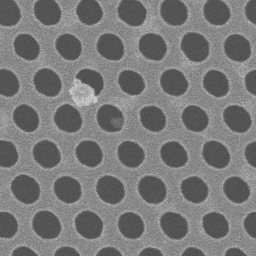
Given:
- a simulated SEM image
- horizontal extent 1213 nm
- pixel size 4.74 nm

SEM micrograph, a regular array of holes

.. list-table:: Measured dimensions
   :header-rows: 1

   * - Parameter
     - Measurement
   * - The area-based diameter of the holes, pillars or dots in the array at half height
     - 128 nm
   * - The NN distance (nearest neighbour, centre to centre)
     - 194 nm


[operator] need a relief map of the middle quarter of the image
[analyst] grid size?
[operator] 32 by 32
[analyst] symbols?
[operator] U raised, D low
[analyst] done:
UUUUUUUUUUUUUUUUUUUUUUUUUUUUUUUU
UUUUDDDUUUUUUUUUUUUUUUUUUUDDUUUU
UUUDDDDDDUUUUUDDDDDUUUUUUDDDDDUU
UUUDDDDDDDUUUUDDDDDDUUUUDDDDDDUU
UUUUDDDDDDUUUUDDDDDDUUUUDDDDDDDU
UUUUUUDDDDUUUUDDDDDDUUUUDDDDDDDU
UUUUUUUDDDUUUUUDDDDDUUUUUDDDDDDU
UUUUUUUDDUUUUUUUDDDUUUUUUUUDDDUU
UUUUUUUUUUUUUUUUUUUUUUUUUUUUUUUU
UUUUUUUUUUUUUUUUUUUUUUUUUUUUUUUU
DDUUUUUUUUDDUUUUUUUUUUUUUUUUUUUD
DDDUUUUUUDDDDDUUUUUDDDDDUUUUUUDD
DDDDUUUUDDDDDDDUUUUDDDDDDUUUUDDD
DDDDUUUUDDDDDDDUUUUDDDDDDUUUUDDD
DDDDDUUUDDDDDDDUUUUDDDDDDDUUUUDD
DDDDUUUUUDDDDDDUUUUUDDDDDUUUUUDD
DDDDUUUUUUDDDDUUUUUUUDDDUUUUUUUU
UUUUUUUUUUUUUUUUUUUUUUUUUUUUUUUU
UUUUUUUUUUUUUUUUUUUUUUUUUUUUUUUU
UUUUDDDDUUUUUUUDDDUUUUUUUUDDUUUU
UUUDDDDDDUUUUUDDDDDUUUUUDDDDDDUU
UUUDDDDDDUUUUDDDDDDDUUUUDDDDDDUU
UUUDDDDDDUUUUDDDDDDDUUUUDDDDDDDU
UUUDDDDDDUUUUUDDDDDDUUUUDDDDDDDU
UUUUDDDDDUUUUUDDDDDDUUUUUDDDDDDU
UUUUUDDDUUUUUUUUDDUUUUUUUUDDDDUU
UUUUUUUUUUUUUUUUUUUUUUUUUUUUUUUU
UUUUUUUUUUUUUUUUUUUUUUUUUUUUUUUU
DDUUUUUUUDDDDUUUUUUUDDDDUUUUUUUD
DDDDUUUUUDDDDDUUUUUDDDDDDUUUUDDD
DDDDUUUUDDDDDDDUUUDDDDDDDUUUUDDD
DDDDUUUUDDDDDDDUUUDDDDDDDDUUUDDD